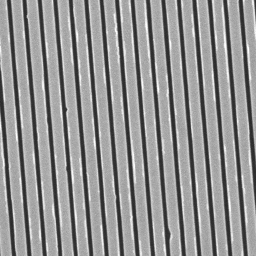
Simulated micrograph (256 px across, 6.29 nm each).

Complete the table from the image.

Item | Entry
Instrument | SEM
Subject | parallel lines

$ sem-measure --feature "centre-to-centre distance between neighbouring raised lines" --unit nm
96.9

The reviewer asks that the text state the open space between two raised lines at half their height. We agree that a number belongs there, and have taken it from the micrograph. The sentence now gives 0.0274 µm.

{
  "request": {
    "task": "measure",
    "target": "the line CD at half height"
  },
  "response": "0.0721 micrometres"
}